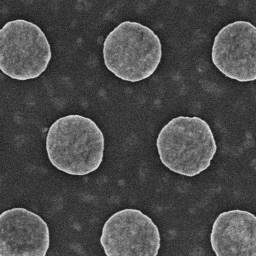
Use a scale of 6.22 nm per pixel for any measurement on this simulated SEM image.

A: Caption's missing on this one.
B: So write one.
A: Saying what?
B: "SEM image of raised bodies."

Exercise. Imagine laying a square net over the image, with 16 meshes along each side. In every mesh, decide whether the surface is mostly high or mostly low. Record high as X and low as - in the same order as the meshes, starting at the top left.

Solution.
----------------
XX------X-----XX
XXX----XXX---XXX
XXX----XXX---XXX
XXX----XXX----XX
----------------
----------------
----XX-----XX---
---XXX----XXX---
---XXX----XXX---
----XX-----XX---
----------------
----------------
XX-----XX-----XX
XXX---XXXX---XXX
XXX---XXXX---XXX